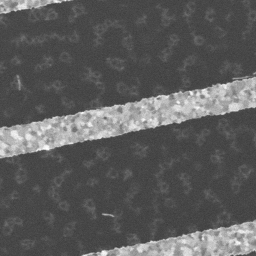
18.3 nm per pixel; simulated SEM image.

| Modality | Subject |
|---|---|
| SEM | one or a few lines or trenches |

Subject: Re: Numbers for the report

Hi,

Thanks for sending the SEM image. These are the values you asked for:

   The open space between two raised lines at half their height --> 2050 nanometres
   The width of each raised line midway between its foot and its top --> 519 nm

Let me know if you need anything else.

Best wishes